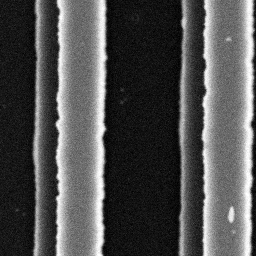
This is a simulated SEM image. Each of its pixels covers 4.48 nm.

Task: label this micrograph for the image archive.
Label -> lines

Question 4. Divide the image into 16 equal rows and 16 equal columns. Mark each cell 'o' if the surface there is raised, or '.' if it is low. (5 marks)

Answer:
..ooooo.....oooo
..ooooo....ooooo
..ooooo....ooooo
..ooooo....ooooo
..ooooo....ooooo
..ooooo....ooooo
..oooo.....ooooo
..oooo.....ooooo
..oooo.....ooooo
..oooo.....ooooo
..oooo.....ooooo
..oooo.....ooooo
..oooo.....ooooo
..oooo.....ooooo
..oooo.....ooooo
..oooo.....ooooo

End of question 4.